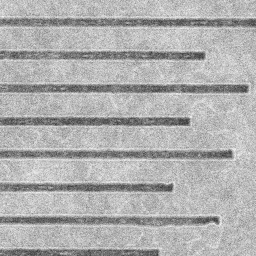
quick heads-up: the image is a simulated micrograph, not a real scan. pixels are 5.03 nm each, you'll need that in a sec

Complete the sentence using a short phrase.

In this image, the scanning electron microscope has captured parallel lines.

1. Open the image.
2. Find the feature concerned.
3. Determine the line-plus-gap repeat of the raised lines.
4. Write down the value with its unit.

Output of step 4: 166 nm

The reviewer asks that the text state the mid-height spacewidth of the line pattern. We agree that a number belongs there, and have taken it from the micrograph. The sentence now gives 45.2 nm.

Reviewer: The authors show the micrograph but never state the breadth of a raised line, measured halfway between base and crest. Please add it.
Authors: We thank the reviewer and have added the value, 0.121 micrometres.